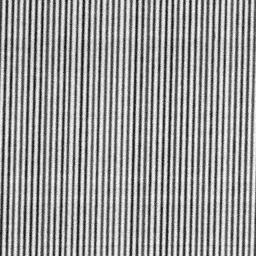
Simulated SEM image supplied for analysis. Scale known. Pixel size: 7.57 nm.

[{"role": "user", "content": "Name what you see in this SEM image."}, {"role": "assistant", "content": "parallel lines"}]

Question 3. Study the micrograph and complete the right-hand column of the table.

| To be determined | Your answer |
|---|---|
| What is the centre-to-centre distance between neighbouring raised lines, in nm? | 44.7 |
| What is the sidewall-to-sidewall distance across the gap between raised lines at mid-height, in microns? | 0.0199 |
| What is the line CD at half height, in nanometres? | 26.5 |